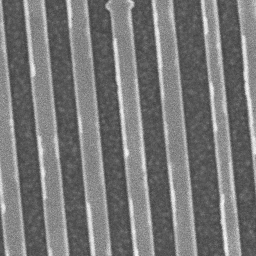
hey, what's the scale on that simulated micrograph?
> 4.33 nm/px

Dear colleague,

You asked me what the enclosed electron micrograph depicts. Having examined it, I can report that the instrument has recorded parallel lines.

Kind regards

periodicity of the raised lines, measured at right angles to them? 188 nm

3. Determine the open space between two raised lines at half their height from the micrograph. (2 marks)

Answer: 0.0975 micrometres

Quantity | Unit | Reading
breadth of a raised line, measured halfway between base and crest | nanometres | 84.6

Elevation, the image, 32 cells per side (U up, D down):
DDDUUUDDUUUDDUUUUDDUUDDDDUUDDDUU
DDDUUUDDUUUDDDUUDDDUUUDDDUUDDDUU
DDDUUUDDDUUDDDUUDDDUUUDDDUUDDDUU
DDDUUUDDDUUDDDUUDDDUUUDDDUUDDDUU
UDDUUUDDDUUDDDUUUDDUUUDDDDUDDDUU
UDDDUUDDDUUDDDUUUDDDUUDDDDUDDDUU
UDDDUUDDDUUDDDUUUDDDUUDDDDUUDDUU
UDDDUUDDDUUDDDUUUDDDUUDDDDUUDDUU
UDDDUUDDDUUUDDUUUDDDUUDDDDUUDDDU
UDDDUUDDDUUUDDUUUDDDUUDDDDUUDDUU
UDDDUUUDDUUUDDDUUDDDUUUDDDUUDDDU
UDDDUUUDDUUUDDDUUDDDUUUDDDUUDDDU
UDDDUUUDDDUUDDDUUDDDUUUDDDUUDDDU
UDDDUUUDDDUUDDDUUDDDUUUDDDUUDDDU
UDDDUUUDDDUUDDDUUUDDUUUDDDDUDDDU
UUDDDUUDDDUUDDDUUUDDDUUDDDDUDDDU
UUDDDUUDDDUUDDDUUUDDDUUDDDDUUDDU
UUDDDUUDDDUUDDDUUUDDDUUDDDDUUDDU
UUDDDUUDDDUUUDDDUUDDDUUDDDDUUDDU
UUDDDUUDDDUUUDDDUUDDDUUDDDDUUDDD
UUDDDUUDDDUUUDDDUUDDDUUUDDDUUDDD
UUDDDUUUDDUUUDDDUUDDDUUUDDDUUDDD
UUDDDUUUDDDUUDDDUUDDDUUUDDDUUDDD
UUDDDUUUDDDUUDDDUUDDDUUUDDDUUDDD
UUDDDUUUDDDUUDDDUUUDDUUUDDDDUDDD
UUUDDDUUDDDUUDDDUUUDDUUUDDDDUDDD
UUUDDDUUDDDUUDDDUUUDDDUUDDDDUUDD
UUUDDDUUDDDUUDDDUUUDDDUUDDDDUUDD
UUUDDDUUDDDUUUDDDUUDDDUUDDDDUUDD
DUUDDDUUDDDUUUDDDUUDDDUUDDDDUUDD
DUUDDDUUDDDUUUDDDUUDDDUUUDDDUUDD
DUUDDDUUUDDUUUDDDUUDDDUUUDDDUUDD